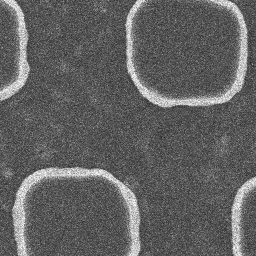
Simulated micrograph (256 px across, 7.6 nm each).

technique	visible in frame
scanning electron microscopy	raised bodies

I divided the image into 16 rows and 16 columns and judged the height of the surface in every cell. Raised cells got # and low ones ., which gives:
#.......#######.
#.......#######.
#.......#######.
#.......#######.
#.......#######.
#........######.
................
................
................
................
................
..######........
.#######.......#
.#######.......#
.#######.......#
.#######.......#